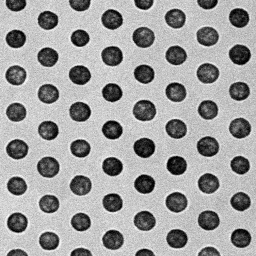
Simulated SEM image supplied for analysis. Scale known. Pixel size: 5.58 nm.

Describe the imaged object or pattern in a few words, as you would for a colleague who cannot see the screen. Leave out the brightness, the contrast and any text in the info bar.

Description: a regular array of holes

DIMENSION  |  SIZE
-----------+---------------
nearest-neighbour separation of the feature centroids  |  203 nanometres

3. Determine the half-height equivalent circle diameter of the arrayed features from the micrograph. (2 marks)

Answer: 117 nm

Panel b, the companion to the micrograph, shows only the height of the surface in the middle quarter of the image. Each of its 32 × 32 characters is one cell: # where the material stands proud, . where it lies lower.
###..######..#####...###########
##....############....##########
#......##########......#########
#......###########.....#########
##....#############...##########
##########....############....##
#########.....###########......#
#########......##########......#
##########....############....##
###..######..#####....#####..###
##....###########......#########
#......##########......#########
#......##########......#########
##....############....##########
####.#####....############....##
##########....###########......#
#########......##########......#
##########.....###########....##
###########...#####..######..###
##....############....##########
#......##########......#########
##.....##########......#########
##....############....##########
###########..#######.######...##
##########....############.....#
#########......###########.....#
##########.....###########.....#
##########....#############...##
##....############....##########
##.....###########.....#########
#......###########.....#########
##.....###########....##########